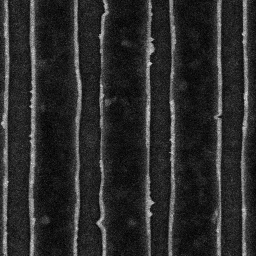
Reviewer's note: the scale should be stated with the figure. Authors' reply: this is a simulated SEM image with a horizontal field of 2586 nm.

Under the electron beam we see one or a few lines or trenches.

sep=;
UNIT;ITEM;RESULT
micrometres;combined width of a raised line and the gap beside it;0.712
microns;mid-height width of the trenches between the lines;0.23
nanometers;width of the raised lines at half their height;495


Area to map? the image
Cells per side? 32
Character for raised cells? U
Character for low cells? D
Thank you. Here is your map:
UDDDUUUUUUDDDUUUUUUDDUUUUUUUDDUU
UDDDUUUUUUDDDUUUUUUDDUUUUUUUDDDU
UDDDUUUUUUDDDUUUUUUDDUUUUUUUDDDU
UDDDUUUUUUDDDUUUUUUDDUUUUUUUDDDU
UDDDUUUUUUDDUUUUUUUDDDUUUUUUDDUU
UDDDUUUUUUDDDUUUUUUDDDUUUUUUDDUU
UDDDUUUUUUDDDUUUUUUDDDUUUUUUDDDU
UDDDUUUUUUDDDUUUUUUDDDUUUUUUDDDU
UDDDUUUUUUDDDUUUUUUDDUUUUUUDDDDU
UDDDUUUUUUDDDUUUUUUDDUUUUUUUDDDU
UDDDUUUUUUDDDUUUUUUDDUUUUUUUDDDU
UDDDUUUUUUDDDUUUUUUDDUUUUUUUDDDU
UDDDUUUUUUDDDUUUUUUDDUUUUUUUDDDU
UDDDUUUUUUDDDUUUUUUDDUUUUUUUDDDU
UDDDUUUUUUDDDUUUUUUDDUUUUUUDDDDU
UDDDUUUUUUDDDUUUUUUDDUUUUUUDDDUU
UDDDUUUUUUDDDUUUUUUDDUUUUUUDDDUU
UDDDUUUUUUDDDUUUUUUDDUUUUUUUDDUU
UDDDUUUUUUDDDUUUUUUDDUUUUUUDDDUU
UDDDUUUUUUDDDUUUUUUDDUUUUUUDDDUU
UDDDUUUUUUDDDUUUUUUDDUUUUUUDDDUU
UDDDUUUUUUDDDUUUUUUDDUUUUUUDDDUU
UDDDUUUUUUDDDUUUUUUDDDUUUUUDDDUU
UDDDUUUUUUDDDUUUUUUDDDUUUUUDDDUU
UDDDUUUUUUDDUUUUUUUDDDUUUUUDDDUU
UDDDUUUUUUDDDUUUUUUDDUUUUUUUDDUU
UDDDUUUUUUDDDUUUUUUDDUUUUUUUDDUU
UDDDUUUUUUDDUUUUUUUDDUUUUUUDDDUU
UDDDUUUUUUDDDUUUUUUDDUUUUUUDDDUU
UDDDUUUUUUDDDUUUUUUDDUUUUUUDDDUU
UDDDUUUUUUDDDUUUUUUDDUUUUUUDDDUU
UDDDUUUUUDDDDUUUUUUDDUUUUUUDDDUU